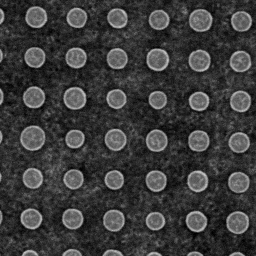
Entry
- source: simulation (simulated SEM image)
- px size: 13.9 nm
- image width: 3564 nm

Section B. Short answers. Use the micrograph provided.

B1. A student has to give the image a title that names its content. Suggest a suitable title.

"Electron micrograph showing a regular array of raised bodies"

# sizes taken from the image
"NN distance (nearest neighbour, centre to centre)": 0.559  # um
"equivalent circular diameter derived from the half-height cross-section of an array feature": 277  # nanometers